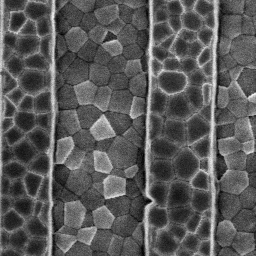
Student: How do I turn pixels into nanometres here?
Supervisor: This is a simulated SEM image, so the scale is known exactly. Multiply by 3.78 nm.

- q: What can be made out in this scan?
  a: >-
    one or a few lines or trenches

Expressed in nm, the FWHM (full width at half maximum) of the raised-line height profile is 242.